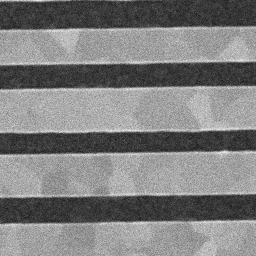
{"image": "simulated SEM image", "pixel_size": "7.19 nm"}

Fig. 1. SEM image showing one or a few lines or trenches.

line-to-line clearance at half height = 183 nm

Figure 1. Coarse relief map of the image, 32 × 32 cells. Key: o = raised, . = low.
.o.............................o
o..........o....................
............o.....o.............
......o.....o...oooo....oooooooo
oooooooooooooooooooooooooooooooo
oooooooooooooooooooooooooooooooo
oooooooooooooooooooooooooooooooo
oooooooooooooooooooooooooooooooo
........ooo.............o.......
..o.......o.....................
.o........o.oo..................
oooooooooooooooooooooooooooooooo
oooooooooooooooooooooooooooooooo
oooooooooooooooooooooooooooooooo
oooooooooooooooooooooooooooooooo
oooooooooooooooooooooooooooooooo
ooo....o........................
................................
................................
oooooooooooooooooooooooooooooooo
oooooooooooooooooooooooooooooooo
oooooooooooooooooooooooooooooooo
oooooooooooooooooooooooooooooooo
oooooooooooooooooooooooooooooooo
oooooo.ooo.oooo.......oo.......o
............ooo......ooo.......o
............ooo......ooo.......o
o........oooo.........oo.......o
oooooooooooooooooooooooooooooooo
oooooooooooooooooooooooooooooooo
oooooooooooooooooooooooooooooooo
oooooooooooooooooooooooooooooooo